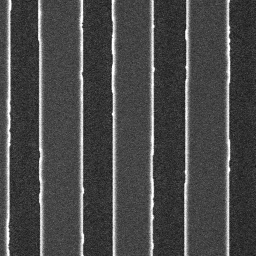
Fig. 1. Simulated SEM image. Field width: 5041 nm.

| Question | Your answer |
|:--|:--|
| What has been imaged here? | lines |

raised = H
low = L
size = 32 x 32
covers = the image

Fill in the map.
HLLLLHHHHHLLLLHHHHHLLLLHHHHHHLLL
HLLLLHHHHHLLLLHHHHHLLLLHHHHHHLLL
HLLLLHHHHHLLLLHHHHHLLLLHHHHHHLLL
HLLLLHHHHHLLLLHHHHHLLLLHHHHHHLLL
HLLLLHHHHHLLLLHHHHHLLLLHHHHHHLLL
HLLLLHHHHHLLLLHHHHHLLLLHHHHHHLLL
HLLLLHHHHHLLLLHHHHHLLLLHHHHHHLLL
HLLLLHHHHHLLLLHHHHHLLLLHHHHHHLLL
HLLLLHHHHHLLLLHHHHHLLLLHHHHHHLLL
HLLLLHHHHHLLLLHHHHHLLLLHHHHHHLLL
HLLLLHHHHHLLLLHHHHHLLLLHHHHHHLLL
HLLLLHHHHHLLLLHHHHHLLLLHHHHHHLLL
HLLLLHHHHHLLLLHHHHHLLLLHHHHHHLLL
HLLLLHHHHHLLLLHHHHHLLLLHHHHHHLLL
HLLLLHHHHHLLLLHHHHHLLLLHHHHHHLLL
HLLLLHHHHHLLLLHHHHHLLLLHHHHHHLLL
HLLLLHHHHHLLLLHHHHHLLLLHHHHHHLLL
HLLLLHHHHHLLLLHHHHHLLLLHHHHHHLLL
HLLLLHHHHHLLLLHHHHHLLLLHHHHHHLLL
HLLLLHHHHHLLLLHHHHHLLLLHHHHHHLLL
HLLLLHHHHHLLLLHHHHHLLLLHHHHHHLLL
HLLLLHHHHHLLLLHHHHHLLLLHHHHHHLLL
HLLLLHHHHHLLLLHHHHHLLLLHHHHHHLLL
HLLLLHHHHHLLLLHHHHHLLLLHHHHHHLLL
HLLLLHHHHHLLLLHHHHHLLLLHHHHHHLLL
HLLLLHHHHHLLLLHHHHHLLLLHHHHHHLLL
HLLLLHHHHHLLLLHHHHHLLLLHHHHHHLLL
HLLLLHHHHHLLLLHHHHHLLLLHHHHHHLLL
HLLLLHHHHHLLLLHHHHHLLLLHHHHHHLLL
HLLLLHHHHHLLLLHHHHHLLLLHHHHHHLLL
HLLLLHHHHHLLLLHHHHHLLLLHHHHHHLLL
HLLLLHHHHHLLLLHHHHHLLLLHHHHHHLLL